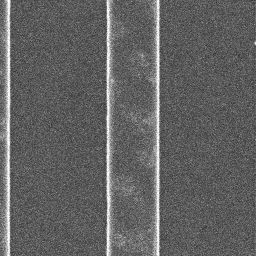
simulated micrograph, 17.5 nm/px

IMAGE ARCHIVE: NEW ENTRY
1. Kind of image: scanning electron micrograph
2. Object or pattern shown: one or a few lines or trenches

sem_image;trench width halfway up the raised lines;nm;1740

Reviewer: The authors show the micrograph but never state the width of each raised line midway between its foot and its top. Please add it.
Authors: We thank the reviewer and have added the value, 892 nm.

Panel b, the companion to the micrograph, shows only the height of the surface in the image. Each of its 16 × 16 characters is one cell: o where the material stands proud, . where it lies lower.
o......ooo......
o......ooo......
o......ooo......
o......ooo......
o......ooo......
o......ooo......
o......ooo......
o......ooo......
o......ooo......
o......ooo......
o......ooo......
o......ooo......
o......ooo......
o......ooo......
o......ooo......
o......ooo......